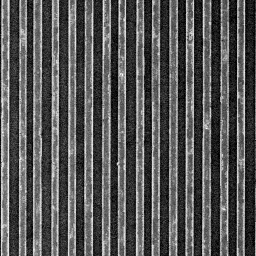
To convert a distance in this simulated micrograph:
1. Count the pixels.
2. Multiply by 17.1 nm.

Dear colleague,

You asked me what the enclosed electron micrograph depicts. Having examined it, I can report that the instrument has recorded parallel lines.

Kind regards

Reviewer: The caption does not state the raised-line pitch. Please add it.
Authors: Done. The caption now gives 288 nanometres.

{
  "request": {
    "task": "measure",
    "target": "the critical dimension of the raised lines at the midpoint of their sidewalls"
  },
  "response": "120 nanometers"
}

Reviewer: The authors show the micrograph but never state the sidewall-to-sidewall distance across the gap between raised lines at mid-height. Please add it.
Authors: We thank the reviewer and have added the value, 180 nanometers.